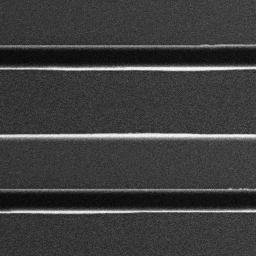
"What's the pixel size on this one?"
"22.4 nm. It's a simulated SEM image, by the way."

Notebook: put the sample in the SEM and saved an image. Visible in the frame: lines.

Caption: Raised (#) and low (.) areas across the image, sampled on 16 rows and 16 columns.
################
################
################
################
................
................
................
................
......##########
################
################
################
################
................
................
................